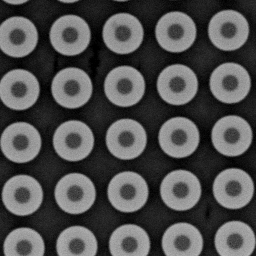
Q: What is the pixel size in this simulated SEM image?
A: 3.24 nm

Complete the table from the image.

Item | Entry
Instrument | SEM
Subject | an array of small figures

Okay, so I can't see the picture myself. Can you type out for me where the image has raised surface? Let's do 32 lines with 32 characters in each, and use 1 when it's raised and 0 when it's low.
00000000000000000000000000000000
00000000000000000000000000001100
01110001110001111000111100111110
11110011111001111100111100111110
11111011111001111100111100111110
11111011111001111100111100011100
01110001110000110000000000000000
00000000000000000000000000000000
00000000000000011000011100011100
01110001111001111100111100111110
11111001111001111100111110111110
11111011111001111100111110011110
11111001111000111000011100011100
01100000000000000000000000000000
00000000000000000000000000000000
00110000111000111000011100011110
11111001111001111100111110011110
11111001111101111100111110011110
11111001111100111100111110011110
01110000111000111000011000000000
00000000000000000000000000000000
00000000000000000000011100001110
01110000111000111100111110011110
11111001111100111100111110011111
11111001111100111100111110011111
01111001111100111100011100001110
01110000110000000000000000000000
00000000000000000000000000000000
00000000011000011100011100001110
01111001111100111100111110011111
01111001111100111110111110011111
01111001111100111110011110011110